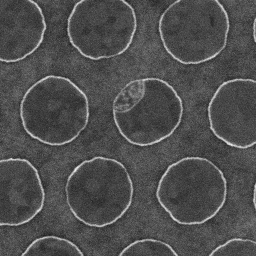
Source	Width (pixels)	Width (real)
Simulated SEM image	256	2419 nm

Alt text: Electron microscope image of raised bodies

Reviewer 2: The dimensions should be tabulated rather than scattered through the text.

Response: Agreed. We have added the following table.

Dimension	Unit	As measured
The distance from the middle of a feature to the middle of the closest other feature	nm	868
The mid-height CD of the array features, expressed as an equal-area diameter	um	0.637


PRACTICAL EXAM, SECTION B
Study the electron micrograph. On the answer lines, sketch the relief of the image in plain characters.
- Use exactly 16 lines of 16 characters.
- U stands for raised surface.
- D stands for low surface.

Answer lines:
UUDDDUUUDDDUUUDD
UUUDUUUUDDUUUUDD
UUUDUUUUDDUUUUDD
UUDDDUUDDDDUUDDD
DDDDDDDDDDDDDDDD
DDUUUDDDDUUDDDUU
DUUUUDDDUUUDDUUU
DUUUUDDUUUUDDUUU
DDUUUDDDUUDDDDUU
DDDDDDDDDDDDDDDD
UUDDDUUUDDDUUUDD
UUUDUUUUDDUUUUDD
UUUDUUUUDDUUUUDD
UUDDDUUUDDDUUDDD
DDDDDDDDDDDDDDDD
DDUUUDDDUUUDDDUU